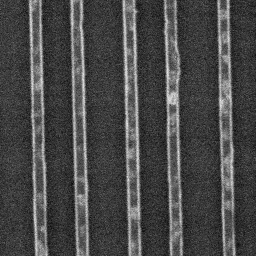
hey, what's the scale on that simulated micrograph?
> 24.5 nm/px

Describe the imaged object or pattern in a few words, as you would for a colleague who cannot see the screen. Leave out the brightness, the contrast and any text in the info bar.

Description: parallel lines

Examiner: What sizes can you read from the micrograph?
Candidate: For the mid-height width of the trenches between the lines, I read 0.898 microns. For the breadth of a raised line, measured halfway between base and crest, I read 258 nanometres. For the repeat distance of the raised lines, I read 1150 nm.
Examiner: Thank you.